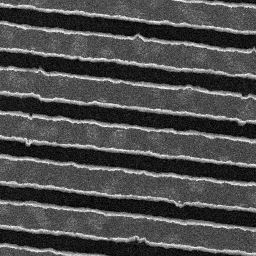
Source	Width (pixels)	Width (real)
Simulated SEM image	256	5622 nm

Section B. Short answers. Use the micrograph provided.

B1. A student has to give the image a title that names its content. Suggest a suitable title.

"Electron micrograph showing parallel lines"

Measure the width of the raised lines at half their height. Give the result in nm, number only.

600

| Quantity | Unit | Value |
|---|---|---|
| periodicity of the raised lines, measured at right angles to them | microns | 0.968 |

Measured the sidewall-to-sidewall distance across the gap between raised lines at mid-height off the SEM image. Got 374 nanometres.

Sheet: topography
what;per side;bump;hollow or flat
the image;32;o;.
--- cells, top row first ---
ooooooooooooooooooooooooooooo...
.......ooooooooooooooooooooooooo
................oooooooooooooooo
oooo.....................ooooooo
ooooooooooooooo..o..............
ooooooooooooooooooooooooo.......
...ooooooooooooooooooooooooooooo
..........oooooooooooooooooooooo
oo..................oooooooooooo
oooooooooo...................ooo
ooooooooooooooooooo.............
ooooooooooooooooooooooooooo.....
.....ooooooooooooooooooooooooooo
................oooooooooooooooo
ooooo....................ooooooo
ooooooooooooo...................
oooooooooooooooooooooooo........
..oooooooooooooooooooooooooooooo
............oooooooooooooooooooo
o..................ooooooooooooo
ooooooooo....................ooo
oooooooooooooooooo..............
ooooooooooooooooooooooooooo.....
......oooooooooooooooooooooooooo
.............ooooooooooooooooooo
ooooo.................oooooooooo
ooooooooooooo...................
oooooooooooooooooooooo..........
.oooooooooooooooooooooooooooooo.
..........oooooooooooooooooooooo
...................ooooooooooooo
ooooooo....................ooooo